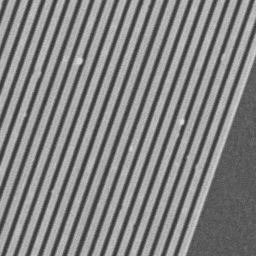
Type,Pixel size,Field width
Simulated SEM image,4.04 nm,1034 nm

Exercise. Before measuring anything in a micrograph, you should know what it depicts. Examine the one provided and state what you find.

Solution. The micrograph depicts parallel lines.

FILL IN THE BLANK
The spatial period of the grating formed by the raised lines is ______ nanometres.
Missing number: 46.9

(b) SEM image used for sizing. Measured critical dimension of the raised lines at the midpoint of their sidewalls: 26.2 nanometres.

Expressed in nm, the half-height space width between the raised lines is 18.6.